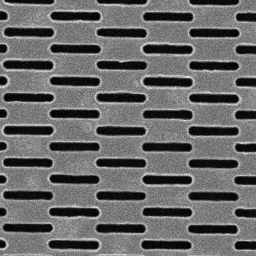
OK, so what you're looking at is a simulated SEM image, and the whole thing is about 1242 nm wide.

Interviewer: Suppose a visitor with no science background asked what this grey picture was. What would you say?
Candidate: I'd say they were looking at a regular array of holes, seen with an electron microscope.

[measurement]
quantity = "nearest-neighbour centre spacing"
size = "158 nm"